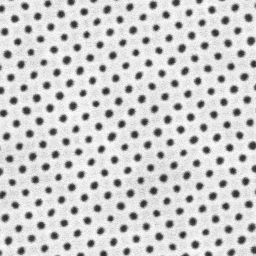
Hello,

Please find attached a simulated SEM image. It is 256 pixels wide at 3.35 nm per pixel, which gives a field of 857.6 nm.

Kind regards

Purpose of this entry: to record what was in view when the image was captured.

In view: a regular array of holes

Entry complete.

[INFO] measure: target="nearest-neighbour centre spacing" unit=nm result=53.6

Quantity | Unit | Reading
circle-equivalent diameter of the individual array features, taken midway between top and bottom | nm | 26.7